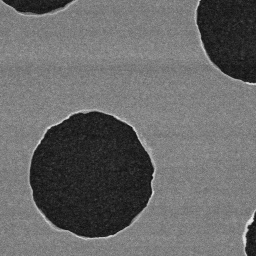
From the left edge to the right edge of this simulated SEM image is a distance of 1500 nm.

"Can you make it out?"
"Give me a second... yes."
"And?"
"holes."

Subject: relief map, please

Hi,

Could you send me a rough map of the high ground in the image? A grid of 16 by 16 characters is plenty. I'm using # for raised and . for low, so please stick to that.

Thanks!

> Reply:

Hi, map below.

#...########....
############....
#############...
#############...
##############..
################
################
####...#########
###......#######
##.......#######
##........######
##.......#######
##.......#######
###......#######
####...########.
###############.